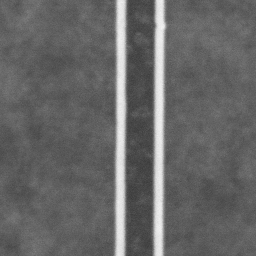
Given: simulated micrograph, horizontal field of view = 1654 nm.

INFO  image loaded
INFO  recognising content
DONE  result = one or a few lines or trenches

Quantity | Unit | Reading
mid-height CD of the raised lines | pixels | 40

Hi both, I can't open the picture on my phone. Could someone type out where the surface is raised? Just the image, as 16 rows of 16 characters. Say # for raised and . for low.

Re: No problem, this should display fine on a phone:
........##......
.......###......
........##......
........##......
........##......
........##......
........##......
........##......
........##......
........##......
........##......
........##......
.......###......
.......###......
.......###......
.......###......